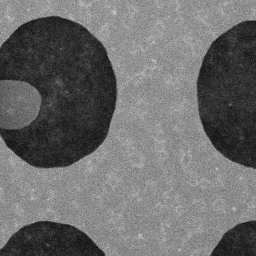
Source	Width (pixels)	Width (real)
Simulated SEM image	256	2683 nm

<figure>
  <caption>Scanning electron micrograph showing holes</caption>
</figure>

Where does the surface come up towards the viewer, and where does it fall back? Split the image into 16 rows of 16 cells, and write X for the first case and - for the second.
XXXXXXXXXXXXXXXX
X----XXXXXXXXXX-
------XXXXXXX---
-------XXXXXX---
-------XXXXX----
-------XXXXX----
-------XXXXX----
-------XXXXXX---
-------XXXXXX---
X-----XXXXXXXX--
XX--XXXXXXXXXXXX
XXXXXXXXXXXXXXXX
XXXXXXXXXXXXXXXX
XXXXXXXXXXXXXXXX
X----XXXXXXXXX--
------XXXXXXX---